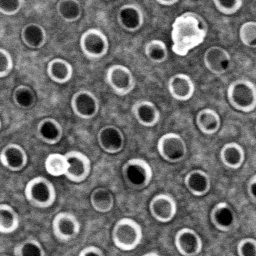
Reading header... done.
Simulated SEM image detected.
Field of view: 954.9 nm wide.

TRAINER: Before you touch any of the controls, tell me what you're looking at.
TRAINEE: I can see a regular array of raised bodies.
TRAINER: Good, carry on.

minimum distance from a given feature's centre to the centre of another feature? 159 nanometers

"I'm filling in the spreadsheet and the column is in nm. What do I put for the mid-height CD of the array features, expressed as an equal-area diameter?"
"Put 95.1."